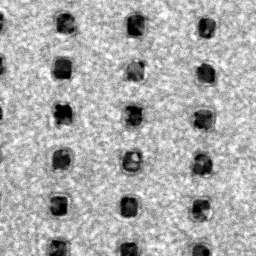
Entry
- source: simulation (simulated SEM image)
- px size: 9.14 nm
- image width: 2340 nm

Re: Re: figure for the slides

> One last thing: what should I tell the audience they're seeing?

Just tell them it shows a regular array of raised bodies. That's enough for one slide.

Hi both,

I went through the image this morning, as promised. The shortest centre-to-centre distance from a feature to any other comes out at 414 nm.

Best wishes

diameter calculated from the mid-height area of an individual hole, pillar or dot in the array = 0.205 microns